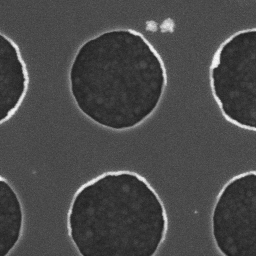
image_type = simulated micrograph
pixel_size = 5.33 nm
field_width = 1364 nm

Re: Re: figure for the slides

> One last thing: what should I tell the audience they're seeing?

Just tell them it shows holes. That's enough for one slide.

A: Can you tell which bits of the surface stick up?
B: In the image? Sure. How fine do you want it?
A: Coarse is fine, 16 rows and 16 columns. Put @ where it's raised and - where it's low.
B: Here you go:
@@@@@@@@@@@@@@@@
@@@@@@@@@@@@@@@@
@@@@@@---@@@@@--
-@@@@-----@@@@--
-@@@------@@@---
-@@@------@@@---
-@@@@-----@@@@--
@@@@@@---@@@@@@-
@@@@@@@@@@@@@@@@
@@@@@@@@@@@@@@@@
@@@@@@@@@@@@@@@@
@@@@@@---@@@@@--
-@@@@-----@@@@--
-@@@------@@@---
-@@@------@@@---
-@@@@-----@@@@--